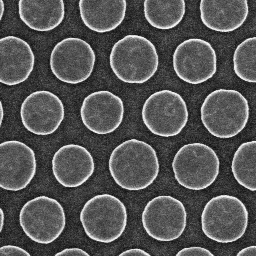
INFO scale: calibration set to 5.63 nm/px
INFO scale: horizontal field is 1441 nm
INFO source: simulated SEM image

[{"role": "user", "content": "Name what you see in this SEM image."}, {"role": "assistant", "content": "a regular array of raised bodies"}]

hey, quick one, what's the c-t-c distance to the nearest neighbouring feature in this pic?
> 0.339 µm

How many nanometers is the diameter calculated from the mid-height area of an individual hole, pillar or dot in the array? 251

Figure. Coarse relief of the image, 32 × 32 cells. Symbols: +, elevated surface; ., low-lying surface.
...+++++..++++++..+++++..++++++.
...+++++..++++++..+++++..++++++.
...+++++...++++....+++...++++++.
....++.....+++............+++...
................................
+++....++++....++++....+++....++
++++...+++++..+++++...+++++..+++
++++..++++++..++++++..+++++..+++
++++..++++++..++++++..+++++..+++
+++....++++....++++...++++....++
.+..............................
.....+......++......+......+++..
...++++....++++...+++++...+++++.
...+++++..+++++...+++++..++++++.
...+++++..+++++...+++++..++++++.
...++++....++++...+++++...+++++.
....++......++.....+++....++++..
................................
++++....++.....++++....+++....++
++++...++++...+++++...+++++..+++
++++...+++++..++++++..+++++..+++
++++...++++...++++++..+++++..+++
++++...++++...+++++...+++++...++
+++.............++......+......+
............++..................
...++++....++++....++++...++++..
...+++++..++++++..+++++..++++++.
...+++++..++++++..+++++..++++++.
...+++++...++++...+++++..++++++.
....+++....++++....+++....++++..
................................
+++.....+++.....++....++++....++